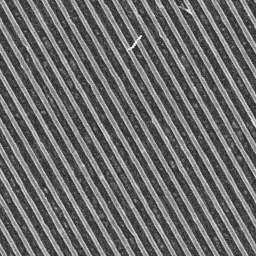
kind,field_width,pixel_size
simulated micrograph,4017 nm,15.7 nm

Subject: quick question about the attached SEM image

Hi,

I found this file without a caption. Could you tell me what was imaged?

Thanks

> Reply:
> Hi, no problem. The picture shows parallel lines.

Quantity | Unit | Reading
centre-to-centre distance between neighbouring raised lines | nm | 193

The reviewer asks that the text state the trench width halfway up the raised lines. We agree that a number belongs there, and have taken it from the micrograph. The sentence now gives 131 nanometres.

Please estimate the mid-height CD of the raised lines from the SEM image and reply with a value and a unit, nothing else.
0.0597 µm